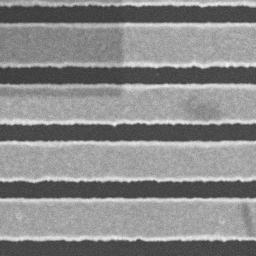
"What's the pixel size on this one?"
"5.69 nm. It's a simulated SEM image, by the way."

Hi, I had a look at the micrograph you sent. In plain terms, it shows lines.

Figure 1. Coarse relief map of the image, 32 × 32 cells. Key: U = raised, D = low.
UUUUUUUUUUUUUUUUUUUUUUUUUUUUUUUU
DDDDDDDDDDDDDDDDDDDDDDDDDDDDDDDD
DDDDDDDDDDDDDDDDDDDDDDDDDDDDDDDD
UUUUUUUUUUUUUUUUUUUUUUUUUUUUUUUU
UUUUUUUUUUUUUUUUUUUUUUUUUUUUUUUU
UUUUUUUUUUUUUUUUUUUUUUUUUUUUUUUU
UUUUUUUUUUUUUUUUUUUUUUUUUUUUUUUU
UUUUUUUUUUUUUUUUUUUUUUUUUUUUUUUU
DDDDDDDDDDDDDDDDDDDDDDDDDDDDDDDD
DDDDDDDDDDDDDDDDDDDDDDDDDDDDDDDD
UUUUUUUDUUUDUUUDUDDDUDUUUUUUUUUU
UUUUUUUUUUUUUUUUUUUUUUUUUUUUUUUU
UUUUUUUUUUUUUUUUUUUUUUUUUUUUUUUU
UUUUUUUUUUUUUUUUUUUUUUUUUUUUUUUU
UUUUUUUUUUUUUUUUUUUUUUUUUUUUUUUU
UUUUUUUUUUUUUUUUUDUUUUUUUUUUUDUU
DDDDDDDDDDDDDDDDDDDDDDDDDDDDDDDD
DDDDDDDDDDDDDDDDDDDDDDDDDDDDDDDD
UUUUUUUUUUUUUUUUUUUUUUUUUUUUUUUU
UUUUUUUUUUUUUUUUUUUUUUUUUUUUUUUU
UUUUUUUUUUUUUUUUUUUUUUUUUUUUUUUU
UUUUUUUUUUUUUUUUUUUUUUUUUUUUUUUU
UUUUUUUUUUUUUUUUUUUUUUUUUUUUUUUU
DDDDDDDDDDDDDDDDDDDDDDDDDDDDDDDD
DDDDDDDDDDDDDDDDDDDDDDDDDDDDDDDD
UUUUUUUUUUUUUUUUUUUUUUUUUUUUUUUU
UUUUUUUUUUUUUUUUUUUUUUUUUUUUUUUU
UUUUUUUUUUUUUUUUUUUUUUUUUUUUUUUU
UUUUUUUUUUUUUUUUUUUUUUUUUUUUUUUU
UUUUUUUUUUUUUUUUUUUUUUUUUUUUUUUU
DDDDDDDDDDDDDDDDDDDDDDDDDDDDDDDD
DDDDDDDDDDDDDDDDDDDDDDDDDDDDDDDD